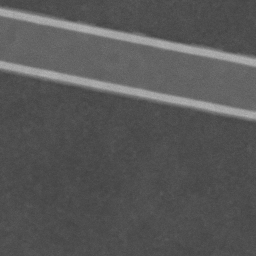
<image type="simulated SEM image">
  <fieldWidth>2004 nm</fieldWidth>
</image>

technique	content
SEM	one or a few lines or trenches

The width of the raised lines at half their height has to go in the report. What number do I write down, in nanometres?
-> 413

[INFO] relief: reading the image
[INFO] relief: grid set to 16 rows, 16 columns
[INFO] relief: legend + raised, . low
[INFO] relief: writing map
................
++++............
+++++++++.......
++++++++++++++..
..++++++++++++++
.......+++++++++
............++++
................
................
................
................
................
................
................
................
................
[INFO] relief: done